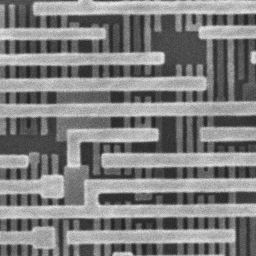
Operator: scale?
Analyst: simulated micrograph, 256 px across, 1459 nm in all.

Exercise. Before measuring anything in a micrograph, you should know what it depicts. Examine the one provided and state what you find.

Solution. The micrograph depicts wiring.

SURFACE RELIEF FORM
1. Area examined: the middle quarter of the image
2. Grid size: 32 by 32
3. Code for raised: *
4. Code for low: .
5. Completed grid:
................................
................................
................................
............********************
********************************
********************************
*********************...********
................................
................................
................................
********************************
********************************
********************************
................................
................................
................................
........***************.........
.***********************........
.***********************........
.***............................
.***............................
.***............................
.***........********..........**
.***.....***********************
.***.....***********************
.***......*******************...
................................
................................
................................
.....***************************
.....***************************
.....***************************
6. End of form